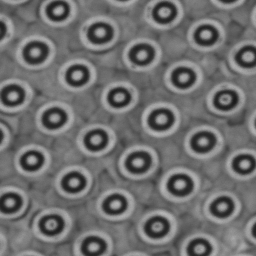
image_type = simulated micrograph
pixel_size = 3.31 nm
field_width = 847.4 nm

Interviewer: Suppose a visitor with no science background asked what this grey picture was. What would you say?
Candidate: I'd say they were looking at a regular array of ring-shaped raised bodies with a dot in the middle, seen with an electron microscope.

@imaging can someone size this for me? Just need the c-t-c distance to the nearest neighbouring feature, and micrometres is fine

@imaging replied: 0.156